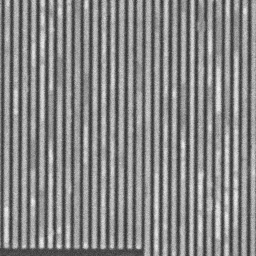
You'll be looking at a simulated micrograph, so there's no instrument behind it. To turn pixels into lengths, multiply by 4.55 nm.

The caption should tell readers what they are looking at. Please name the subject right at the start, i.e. parallel lines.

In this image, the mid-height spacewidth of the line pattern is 21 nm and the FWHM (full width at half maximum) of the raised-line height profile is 16.5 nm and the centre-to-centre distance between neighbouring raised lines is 40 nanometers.